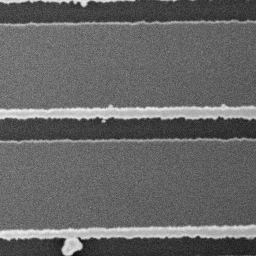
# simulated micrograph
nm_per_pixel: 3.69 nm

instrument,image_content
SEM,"lines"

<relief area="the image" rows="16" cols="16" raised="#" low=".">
................
..##############
################
################
################
################
################
................
................
################
################
################
################
################
################
....#...........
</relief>